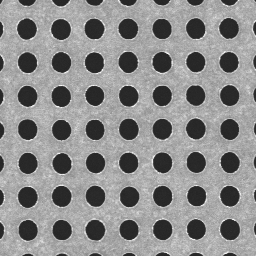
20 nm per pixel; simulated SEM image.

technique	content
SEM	a regular array of holes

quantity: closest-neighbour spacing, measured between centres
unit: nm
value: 664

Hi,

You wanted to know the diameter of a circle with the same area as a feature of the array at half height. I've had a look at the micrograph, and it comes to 0.402 micrometres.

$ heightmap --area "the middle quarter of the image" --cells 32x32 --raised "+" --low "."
..+++.....++++....++++.....++++.
.+++++....+++++...+++++...+++++.
++++++++++++++++++++++++++++++++
++++++++++++++++++++++++++++++++
++++++++++++++++++++++++++++++++
+++++++.++++++++.+++++++.+++++++
.+++++....++++....+++++....++++.
..+++.....++++.....+++.....++++.
..+++.....++++.....+++.....++++.
.+++++....++++....+++++....++++.
+++++++++++++++..+++++++.+++++++
++++++++++++++++++++++++++++++++
++++++++++++++++++++++++++++++++
++++++++++++++++++++++++++++++++
.+++++...+++++....+++++...+++++.
..++++....++++....++++.....++++.
..+++.....++++.....+++.....++++.
..++++....++++....++++.....++++.
.+++++...++++++...+++++...++++++
++++++++++++++++++++++++++++++++
++++++++++++++++++++++++++++++++
++++++++++++++++++++++++++++++++
+++++++..++++++..++++++...++++++
.+++++....++++....++++.....++++.
..+++.....++++.....+++.....++++.
..+++.....++++.....+++.....++++.
.+++++....++++....+++++...++++++
++++++++++++++++++++++++++++++++
++++++++++++++++++++++++++++++++
++++++++++++++++++++++++++++++++
+++++++.++++++++.+++++++.+++++++
.+++++....++++....+++++....++++.